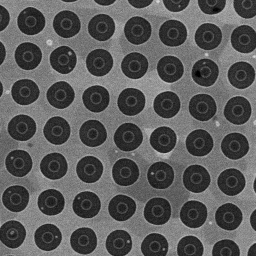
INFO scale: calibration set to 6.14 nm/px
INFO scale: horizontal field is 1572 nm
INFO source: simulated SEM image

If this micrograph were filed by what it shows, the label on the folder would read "an array of small figures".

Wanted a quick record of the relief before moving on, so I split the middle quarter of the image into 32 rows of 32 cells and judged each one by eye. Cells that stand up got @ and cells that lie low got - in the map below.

---@@@------@@-------@@-------@@
--@@@@------@@-------@@-------@@
-@@@@@@----@@@@-----@@@-------@@
@@@@@@@@@@@@@@@@---@@@@@-----@@@
-@@@@@@@@@@@@@@@@@@@@@@@@---@@@@
--@@@@@---@@@@@@@@@@@@@@@@@@@@@@
--@@@------@@@@----@@@@@@@@@@@@@
---@@------@@@------@@@@----@@@@
---@--------@-------@@@------@@@
--@@@------@@-------@@-------@@-
-@@@@------@@-------@@-------@@-
@@@@@@----@@@@------@@-------@@-
@@@@@@@@@@@@@@@----@@@@-----@@@-
@@@@@@@@@@@@@@@@@@@@@@@@@--@@@@@
-@@@@----@@@@@@@@@@@@@@@@@@@@@@@
-@@@------@@@@----@@@@@@@@@@@@@@
--@@-------@@------@@@-----@@@@@
--@@-------@@-------@@------@@@-
-@@@-------@--------@-------@@@-
@@@@------@@@-------@-------@@--
@@@@@@---@@@@------@@@------@@--
@@@@@@@@@@@@@@----@@@@@----@@@@-
@@@@@@@@@@@@@@@@@@@@@@@@@@@@@@@@
@@@@@---@@@@@@--@@@@@@@@@@@@@@@@
-@@------@@@@-----@@@@@--@@@@@@@
-@@-------@@------@@@@-----@@@@-
-@@-------@@-------@@------@@@--
-@@-------@@-------@@-------@@--
@@@@-----@@@-------@@-------@@--
@@@@@---@@@@@-----@@@------@@@--
@@@@@@@@@@@@@@--@@@@@@-----@@@--
@@@@@@@@@@@@@@@@@@@@@@@@@@@@@@@-